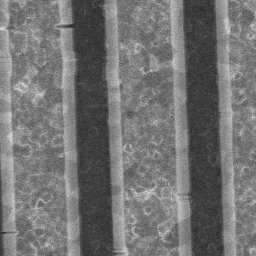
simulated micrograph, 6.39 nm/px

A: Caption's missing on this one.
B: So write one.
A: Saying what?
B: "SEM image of one or a few lines or trenches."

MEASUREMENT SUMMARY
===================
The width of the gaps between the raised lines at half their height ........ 287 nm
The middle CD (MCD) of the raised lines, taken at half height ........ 0.419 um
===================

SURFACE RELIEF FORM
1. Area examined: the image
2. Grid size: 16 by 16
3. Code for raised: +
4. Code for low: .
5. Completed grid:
++++...++++...++
++++...++++...++
++++...++++...++
++++...++++...++
++++...++++...++
++++...++++...++
++++...++++...++
++++...++++...++
++++...++++...++
++++...++++...++
++++...++++...++
++++...++++...++
.++++..++++...++
.++++..+++++..++
.++++..+++++..++
.++++...++++..++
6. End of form